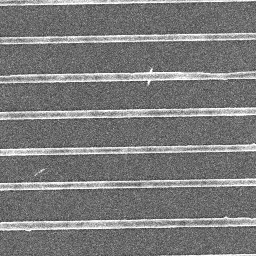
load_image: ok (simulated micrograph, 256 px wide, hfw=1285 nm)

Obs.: parallel lines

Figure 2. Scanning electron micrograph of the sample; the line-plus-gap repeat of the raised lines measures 0.186 um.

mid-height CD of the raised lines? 35.1 nm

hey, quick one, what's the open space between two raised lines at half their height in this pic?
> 29.6 px